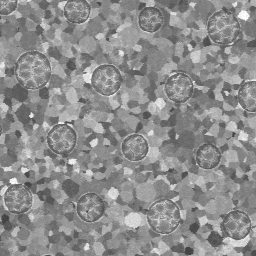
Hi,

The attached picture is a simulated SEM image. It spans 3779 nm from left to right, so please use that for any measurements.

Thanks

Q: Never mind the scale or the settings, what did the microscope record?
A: a regular array of holes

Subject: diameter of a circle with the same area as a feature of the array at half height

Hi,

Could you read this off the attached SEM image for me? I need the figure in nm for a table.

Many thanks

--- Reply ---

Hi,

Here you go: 442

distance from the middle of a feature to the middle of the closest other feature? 1080 nanometers